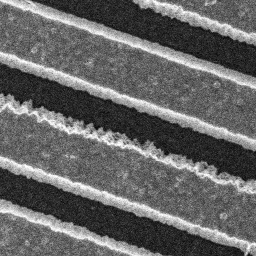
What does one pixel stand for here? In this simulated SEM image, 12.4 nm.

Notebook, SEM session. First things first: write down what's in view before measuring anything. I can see one or a few lines or trenches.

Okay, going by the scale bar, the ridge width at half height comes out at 0.723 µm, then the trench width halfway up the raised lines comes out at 502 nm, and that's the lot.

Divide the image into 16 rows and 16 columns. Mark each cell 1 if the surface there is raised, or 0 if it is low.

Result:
1100000000111111
1111100000000111
1111111100000000
1111111111100000
0001111111111100
0000001111111111
1000000011111111
1111000000011111
1111111000000011
1111111110000000
0111111111110000
0000111111111111
0000000111111111
1100000000111111
1111100000000111
1111111100000000